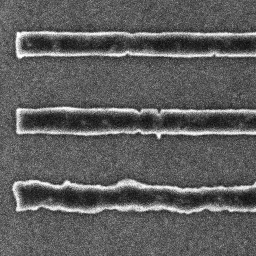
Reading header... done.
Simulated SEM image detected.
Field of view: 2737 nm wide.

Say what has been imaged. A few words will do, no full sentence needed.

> one or a few lines or trenches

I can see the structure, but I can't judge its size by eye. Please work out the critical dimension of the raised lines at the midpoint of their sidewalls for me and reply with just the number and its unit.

251 nanometres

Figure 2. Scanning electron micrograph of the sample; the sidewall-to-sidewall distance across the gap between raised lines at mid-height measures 572 nm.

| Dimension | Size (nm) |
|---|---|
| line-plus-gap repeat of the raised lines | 819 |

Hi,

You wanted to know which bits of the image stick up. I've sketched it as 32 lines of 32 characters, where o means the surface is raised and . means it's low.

................................
................................
................................
................................
..oooooooooooooooooooooooooooooo
..oooooooooooooooooooooooooooooo
..oooooooooooooooooooooooooooooo
................................
................................
................................
................................
................................
................................
.......oo.......................
..oooooooooooooooooooooooooooooo
..oooooooooooooooooooooooooooooo
...o.ooooooooooooooooooooooooooo
................................
................................
................................
................................
................................
................................
..oooooooooooooooooooo...o...ooo
..oooooooooooooooooooooooooooooo
..oooooooooooooooooooooooooooooo
..........oo..........oo........
................................
................................
................................
................................
................................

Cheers